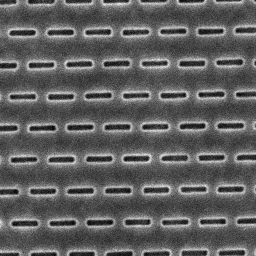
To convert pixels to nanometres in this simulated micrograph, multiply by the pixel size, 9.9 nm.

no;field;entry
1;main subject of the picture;a regular array of holes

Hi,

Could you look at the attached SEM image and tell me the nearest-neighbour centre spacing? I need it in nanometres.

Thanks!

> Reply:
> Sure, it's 362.